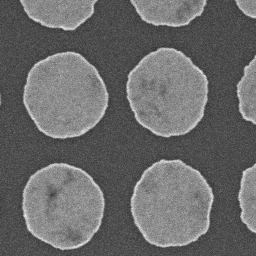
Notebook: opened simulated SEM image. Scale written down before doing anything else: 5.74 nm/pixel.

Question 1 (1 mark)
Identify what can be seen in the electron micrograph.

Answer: raised bodies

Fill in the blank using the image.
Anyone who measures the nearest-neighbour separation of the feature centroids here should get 0.609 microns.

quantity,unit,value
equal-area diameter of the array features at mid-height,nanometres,468